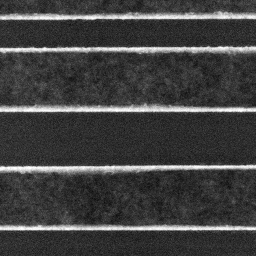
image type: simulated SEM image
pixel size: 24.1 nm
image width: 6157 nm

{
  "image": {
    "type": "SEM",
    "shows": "lines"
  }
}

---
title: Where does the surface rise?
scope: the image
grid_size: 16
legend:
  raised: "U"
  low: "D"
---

UUUUUUUUUUUUUUUU
DDDDDDDDDDDDDDDD
DDDDDDDDDDDDDDDD
UUUUUUUUUUUUUUUU
UUUUUUUUUUUUUUUU
UUUUUUUUUUUUUUUU
UUUUUUUUUUUUUUUU
DDDDDDDDDDDDDDDD
DDDDDDDDDDDDDDDD
DDDDDDDDDDDDDDDD
DDDDDDDUUUUUUUUU
UUUUUUUUUUUUUUUU
UUUUUUUUUUUUUUUU
UUUUUUUUUUUUUUUU
DDDDDDDDDDDDDDDD
DDDDDDDDDDDDDDDD